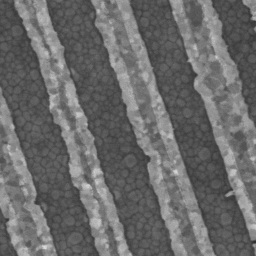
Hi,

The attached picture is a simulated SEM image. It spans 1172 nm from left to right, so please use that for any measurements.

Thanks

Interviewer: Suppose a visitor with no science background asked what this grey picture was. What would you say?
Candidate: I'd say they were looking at one or a few lines or trenches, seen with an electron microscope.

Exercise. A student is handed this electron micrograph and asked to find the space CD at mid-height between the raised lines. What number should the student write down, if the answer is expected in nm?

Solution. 229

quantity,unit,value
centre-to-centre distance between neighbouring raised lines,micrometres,0.346